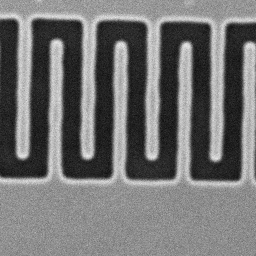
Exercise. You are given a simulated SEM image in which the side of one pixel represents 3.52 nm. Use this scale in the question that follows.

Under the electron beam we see groups of lines, slits or small figures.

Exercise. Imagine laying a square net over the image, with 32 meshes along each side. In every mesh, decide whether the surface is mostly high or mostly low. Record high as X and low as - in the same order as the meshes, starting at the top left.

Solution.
XXXXXXXXXXXXXXXXXXXXXXXXXXXXXXXX
XXXXXXXXXXXXXXXXXXXXXXXXXXXXXXXX
--XX------XXX----XXXXXXXXXXXXXXX
--XX------XX-------X------XX----
--XX------XX-------X------XX----
--XX--XX--XX---X---X---X--XX---X
--XX--XX--XX--XX---X---X--XX---X
--XX--XX--XX--XX---X---X--XX---X
--XX--XX--XX--XX---X--XX--XX---X
--XX--XX--XX--XX---X--XX--XX---X
--XX--XX--XX--XX--XX--XX--XX---X
--XX--XX--XX--XX--XX--XX--XX---X
--XX--XX--XX--XX--XX--XX--XX---X
--XX--XX--XX--XX--XX--XX--XX---X
--XX--XX--XX--XX--XX--XX--XX--XX
--XX--XX--XX--XX--XX--XX--XX--XX
--XX--X---XX--XX--XX--XX--XX--XX
--XX--X---XX--XX--XX--XX--XX--XX
--XX--X---XX--XX--XX--XX--XX--XX
--X---XX--XX--XX--XX--XX--XX--XX
------XX------XX------XX------XX
------XX------XX------XX------XX
XXXXXXXXX----XXX------XX------XX
XXXXXXXXXXXXXXXXXXXXXXXXXXXXXXXX
XXXXXXXXXXXXXXXXXXXXXXXXXXXXXXXX
XXXXXXXXXXXXXXXXXXXXXXXXXXXXXXXX
XXXXXXXXXXXXXXXXXXXXXXXXXXXXXXXX
XXXXXXXXXXXXXXXXXXXXXXXXXXXXXXXX
XXXXXXXXXXXXXXXXXXXXXXXXXXXXXXXX
XXXXXXXXXXXXXXXXXXXXXXXXXXXXXXXX
XXXXXXXXXXXXXXXXXXXXXXXXXXXXXXXX
XXXXXXXXXXXXXXXXXXXXXXXXXXXXXXXX